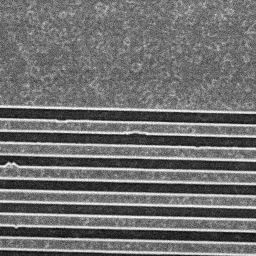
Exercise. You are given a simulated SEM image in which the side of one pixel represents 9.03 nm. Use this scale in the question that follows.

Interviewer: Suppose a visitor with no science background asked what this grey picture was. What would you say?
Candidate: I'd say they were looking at parallel lines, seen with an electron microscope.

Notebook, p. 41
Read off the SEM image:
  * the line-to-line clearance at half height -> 100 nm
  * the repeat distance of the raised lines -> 214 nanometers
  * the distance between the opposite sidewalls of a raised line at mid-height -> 0.114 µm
